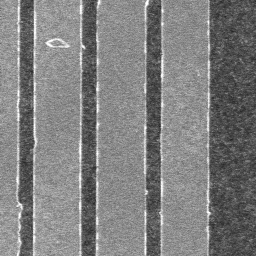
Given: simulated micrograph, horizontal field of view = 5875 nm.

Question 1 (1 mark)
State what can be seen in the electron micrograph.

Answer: one or a few lines or trenches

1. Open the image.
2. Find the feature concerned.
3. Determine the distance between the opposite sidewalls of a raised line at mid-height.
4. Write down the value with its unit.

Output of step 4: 1.09 um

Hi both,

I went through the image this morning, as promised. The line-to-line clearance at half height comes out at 370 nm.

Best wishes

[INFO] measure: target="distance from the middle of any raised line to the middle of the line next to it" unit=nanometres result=1450